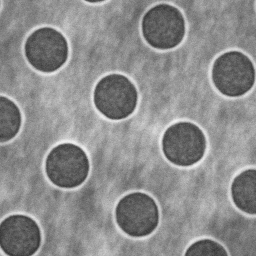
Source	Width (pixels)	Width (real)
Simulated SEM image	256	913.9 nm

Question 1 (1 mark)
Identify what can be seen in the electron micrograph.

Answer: holes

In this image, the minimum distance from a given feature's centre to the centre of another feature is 0.3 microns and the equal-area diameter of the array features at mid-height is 0.162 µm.